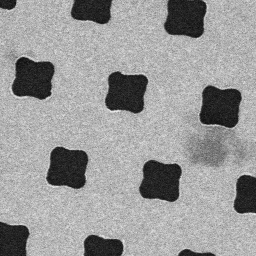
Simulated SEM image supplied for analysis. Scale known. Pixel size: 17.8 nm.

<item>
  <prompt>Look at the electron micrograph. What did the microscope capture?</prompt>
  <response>holes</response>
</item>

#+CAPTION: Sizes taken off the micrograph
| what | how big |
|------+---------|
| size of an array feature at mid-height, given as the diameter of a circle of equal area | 0.757 micrometres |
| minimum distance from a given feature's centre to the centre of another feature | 1670 nm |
